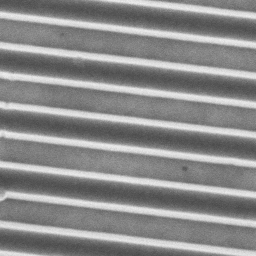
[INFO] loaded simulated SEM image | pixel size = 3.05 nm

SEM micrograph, parallel lines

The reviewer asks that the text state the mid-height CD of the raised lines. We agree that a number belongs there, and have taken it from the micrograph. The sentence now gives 91.7 nanometers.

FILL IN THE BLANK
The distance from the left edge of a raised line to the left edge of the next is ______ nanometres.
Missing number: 181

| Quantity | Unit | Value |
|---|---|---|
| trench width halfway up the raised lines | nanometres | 88.7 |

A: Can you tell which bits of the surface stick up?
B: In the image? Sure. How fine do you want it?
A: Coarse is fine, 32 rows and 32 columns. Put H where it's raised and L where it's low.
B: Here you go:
HHHHHHHHHHHHHHHHHHHHLLLLLLLLLLLL
HHHHHHHHHHHHHHHHHHHHHHHHHHHHHLLL
LLLLLHHHHHHHHHHHHHHHHHHHHHHHHHHH
LLLLLLLLLLLLLHHHHHHHHHHHHHHHHHHH
LLLLLLLLLLLLLLLLLLLLLHHHHHHHHHHH
LLLLLLLLLLLLLLLLLLLLLLLLLLLLLLHH
HHHHHHHLLLLLLLLLLLLLLLLLLLLLLLLL
HHHHHHHHHHHHHHHHLLLLLLLLLLLLLLLL
HHHHHHHHHHHHHHHHHHHHHHHHLLLLLLLL
LHHHHHHHHHHHHHHHHHHHHHHHHHHHHHHH
LLLLLLLLLHHHHHHHHHHHHHHHHHHHHHHH
LLLLLLLLLLLLLLLLLLHHHHHHHHHHHHHH
LLLLLLLLLLLLLLLLLLLLLLLLLLHHHHHH
HHHHHLLLLLLLLLLLLLLLLLLLLLLLLLLL
HHHHHHHHHHHHHLLLLLLLLLLLLLLLLLLL
HHHHHHHHHHHHHHHHHHHHLLLLLLLLLLLL
HHHHHHHHHHHHHHHHHHHHHHHHHHHHHHLL
LLLLLLHHHHHHHHHHHHHHHHHHHHHHHHHH
LLLLLLLLLLLLLLHHHHHHHHHHHHHHHHHH
LLLLLLLLLLLLLLLLLLLLLLHHHHHHHHHH
LLLLLLLLLLLLLLLLLLLLLLLLLLLLLLLH
HHHHHHHHLLLLLLLLLLLLLLLLLLLLLLLL
HHHHHHHHHHHHHHHHHLLLLLLLLLLLLLLL
HHHHHHHHHHHHHHHHHHHHHHHHHLLLLLLL
HLHHHHHHHHHHHHHHHHHHHHHHHHHHHHHH
LLLLLLLLLLHHHHHHHHHHHHHHHHHHHHHH
LLLLLLLLLLLLLLLLLLLHHHHHHHHHHHHH
LLLLLLLLLLLLLLLLLLLLLLLLLLLHHHHH
HHHHHLLLLLLLLLLLLLLLLLLLLLLLLLLL
HHHHHHHHHHHHHLLLLLLLLLLLLLLLLLLL
HHHHHHHHHHHHHHHHHHHHHLLLLLLLLLLL
HHHHHHHHHHHHHHHHHHHHHHHHHHHHHHLL